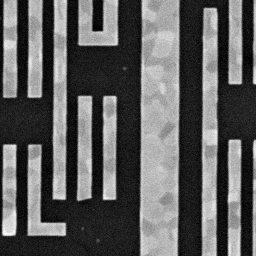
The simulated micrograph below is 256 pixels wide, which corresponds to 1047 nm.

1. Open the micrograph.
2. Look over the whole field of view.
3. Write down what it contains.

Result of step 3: wiring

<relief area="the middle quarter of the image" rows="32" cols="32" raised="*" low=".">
....................*********...
....................*********...
....................*********...
...................**********...
...................**********...
....................*********...
....................*********...
...................**********...
....***...***......**********...
....***...***......**********...
....***...***......**********...
....***...***......**********...
....***...***......**********...
....***...***......**********...
....***...***......**********...
....***...***......**********...
....***...***......**********...
....***...***......**********...
....***...***......**********...
....***...***......**********...
....***...***......**********...
....***...***......**********...
....***...***......**********...
....***...***......**********...
....***...***......**********...
....***...***......**********...
....***...***......*********....
....***...***......*********....
....***...***......*********....
....***...***......*********....
....***...***......*********....
...****...***......*********....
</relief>